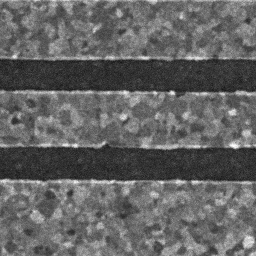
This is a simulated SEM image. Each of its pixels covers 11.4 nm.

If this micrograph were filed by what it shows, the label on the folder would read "one or a few lines or trenches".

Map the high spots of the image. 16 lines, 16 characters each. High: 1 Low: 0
1111111111111111
1111111111111111
1111111111111111
1111111111111111
0000000000000000
0000000000000000
1111111111111111
1111111111111111
1111111111111111
0000000000000000
0000000000000000
1111111111111111
1111111111111111
1111111111111111
1111111111111111
1111111111111111